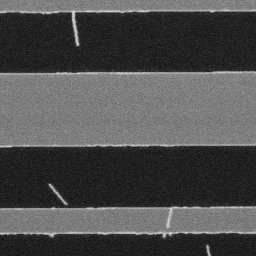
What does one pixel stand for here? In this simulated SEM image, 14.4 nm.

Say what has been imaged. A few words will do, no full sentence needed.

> lines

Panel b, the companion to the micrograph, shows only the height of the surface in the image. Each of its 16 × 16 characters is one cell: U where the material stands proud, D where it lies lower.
UUUUUUUUUUUUUUUU
DDDDDDDDDDDDDDDD
DDDDDDDDDDDDDDDD
DDDDDDDDDDDDDDDD
DDDDDDDDDDDDDDDD
UUUUUUUUUUUUUUUU
UUUUUUUUUUUUUUUU
UUUUUUUUUUUUUUUU
UUUUUUUUUUUUUUUU
DDDDDDDDDDDDDDDD
DDDDDDDDDDDDDDDD
DDDDDDDDDDDDDDDD
DDDDDDDDDDDDDDDD
UUUUUUUUUUUUUUUU
UUUUUUUUUUUUUUUU
DDDDDDDDDDDDDDDD